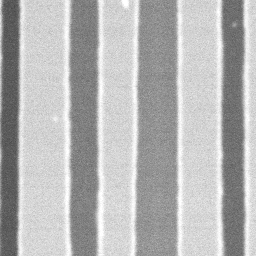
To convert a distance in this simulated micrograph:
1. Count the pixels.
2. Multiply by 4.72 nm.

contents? lines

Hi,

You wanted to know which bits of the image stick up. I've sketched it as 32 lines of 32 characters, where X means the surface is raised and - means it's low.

---XXXXX----XXXXX-----XXXXX----X
---XXXXX-----XXXX-----XXXXX----X
---XXXXX-----XXXX-----XXXXX----X
---XXXXX-----XXXX-----XXXXX----X
---XXXXX-----XXXX-----XXXXX----X
---XXXXX-----XXXX-----XXXXXX---X
---XXXXX-----XXXX-----XXXXXX---X
---XXXXX-----XXXX-----XXXXXX---X
---XXXXX-----XXXX-----XXXXX----X
---XXXXX-----XXXX-----XXXXX----X
---XXXXX-----XXXX-----XXXXX----X
---XXXXX-----XXXX-----XXXXXX---X
---XXXXX-----XXXX-----XXXXX----X
---XXXXX-----XXXX-----XXXXX----X
---XXXXX-----XXXX-----XXXXX----X
---XXXXX-----XXXX-----XXXXX----X
---XXXXX-----XXXX-----XXXXX----X
---XXXXX-----XXXX-----XXXXX----X
---XXXXX-----XXXX-----XXXXX----X
---XXXXX-----XXXX-----XXXXXX---X
---XXXXX-----XXXX-----XXXXX----X
---XXXXX-----XXXX-----XXXXX----X
---XXXXX-----XXXX-----XXXXX----X
---XXXXX-----XXXX-----XXXXXX---X
---XXXXX-----XXXX-----XXXXXX---X
---XXXXX-----XXXX-----XXXXX----X
--XXXXXX-----XXXX-----XXXXX----X
---XXXXX-----XXXX-----XXXXX----X
--XXXXXX-----XXXX-----XXXXXX---X
--XXXXXX-----XXXX-----XXXXXX---X
--XXXXXXX----XXXX-----XXXXXX---X
--XXXXXXX----XXXX-----XXXXXX---X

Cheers